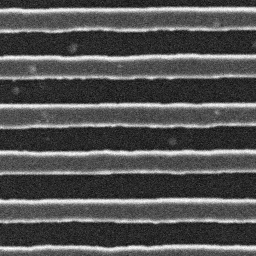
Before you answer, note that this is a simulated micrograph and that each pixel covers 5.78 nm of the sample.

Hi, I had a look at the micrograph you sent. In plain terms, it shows lines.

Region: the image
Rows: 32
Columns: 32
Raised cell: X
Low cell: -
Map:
--------------------------------
XXXXXXXXXXXXXXXXXXXXXXXXXXXXXXXX
XXXXXXXXXXXXXXXXXXXXXXXXXXXXXXXX
XXXXXXXXXXXXXXXXXXXXXXXXXXXXXXXX
--------------------------------
--------------------------------
--------------------------------
XXXXXXXXXXXXXXXXXXXXXXXXXXXXXXXX
XXXXXXXXXXXXXXXXXXXXXXXXXXXXXXXX
XXXXXXXXXXXXXXXXXXXXXXXXXXXXXXXX
--------------------------------
--------------------------------
--------------------------------
XXXXXXXXXXXXXXXXXXXXXXXXXXXXXXXX
XXXXXXXXXXXXXXXXXXXXXXXXXXXXXXXX
XXXXXXXXXXXXXXXXXXXXXXXXXXXXXXXX
--------------------------------
--------------------------------
--------------------------------
XXXXXXXXXXXXXXXXXXXXXXXXXXXXXXXX
XXXXXXXXXXXXXXXXXXXXXXXXXXXXXXXX
XXXXXXXXXXXXXXXXXXXXXXXXXXXX----
--------------------------------
--------------------------------
--------------------------------
XXXXXXXXXXXXXXXXXXXXXXXXXXXXXXXX
XXXXXXXXXXXXXXXXXXXXXXXXXXXXXXXX
XXXXXXXXXXXXXXXXXXXXXXXXXXXXXXXX
--------------------------------
--------------------------------
--------------------------------
XXXXXXXXXXXXXXXXXXXXXXXXXXXXXXXX